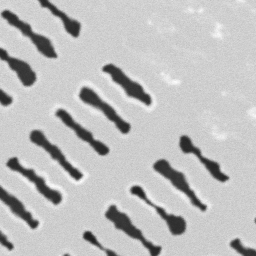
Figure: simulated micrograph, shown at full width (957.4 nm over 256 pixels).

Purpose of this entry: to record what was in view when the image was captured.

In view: a regular array of holes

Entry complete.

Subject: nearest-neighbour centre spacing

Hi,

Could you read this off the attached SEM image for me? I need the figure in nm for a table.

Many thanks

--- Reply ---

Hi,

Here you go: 126